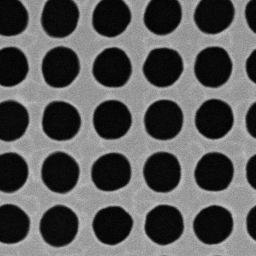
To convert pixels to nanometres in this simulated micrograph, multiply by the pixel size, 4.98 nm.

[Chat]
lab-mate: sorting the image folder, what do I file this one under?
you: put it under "a regular array of holes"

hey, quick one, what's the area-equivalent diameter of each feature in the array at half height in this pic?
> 0.197 micrometres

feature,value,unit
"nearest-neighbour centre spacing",253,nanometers